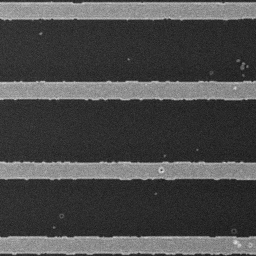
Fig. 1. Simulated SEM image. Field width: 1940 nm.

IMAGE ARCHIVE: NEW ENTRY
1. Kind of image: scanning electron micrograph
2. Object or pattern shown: lines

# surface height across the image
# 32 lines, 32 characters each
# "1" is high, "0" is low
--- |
11111111111111111111111111111111
11111111111111111111111111111111
00000000000000000000000000000000
00000000000000000000000000000000
00000000000000000000000000000000
00000000000000000000000000000000
00000000000000000000000000000000
00000000000000000000000000000000
00000000000000000000000000000000
00000000000000000000000000000000
11111111111111111111111111111111
11111111111111111111111111111111
00000000000000000000000000000000
00000000000000000000000000000000
00000000000000000000000000000000
00000000000000000000000000000000
00000000000000000000000000000000
00000000000000000000000000000000
00000000000000000000000000000000
00000000000000000000000000000000
11111111111111111111111111111111
11111111111111111111111111111111
00000000000000000000000000000000
00000000000000000000000000000000
00000000000000000000000000000000
00000000000000000000000000000000
00000000000000000000000000000000
00000000000000000000000000000000
00000000000000000000000000000000
00000000000000000000000000000000
11111111111111111111111111111111
11111111111111111111111111111111